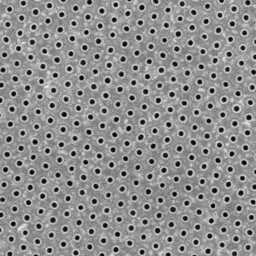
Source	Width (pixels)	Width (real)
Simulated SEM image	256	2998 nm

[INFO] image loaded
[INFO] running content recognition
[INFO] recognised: a regular array of holes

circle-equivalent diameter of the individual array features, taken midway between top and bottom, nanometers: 66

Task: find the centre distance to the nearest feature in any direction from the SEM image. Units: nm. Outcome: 175